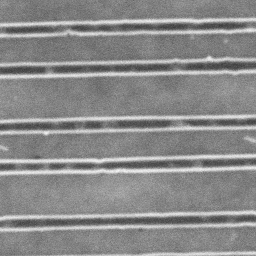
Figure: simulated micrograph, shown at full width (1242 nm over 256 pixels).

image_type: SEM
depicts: parallel lines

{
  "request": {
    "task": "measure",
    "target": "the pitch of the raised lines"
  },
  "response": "0.235 microns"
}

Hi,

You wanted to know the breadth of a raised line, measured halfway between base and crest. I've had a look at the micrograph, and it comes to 60 nm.